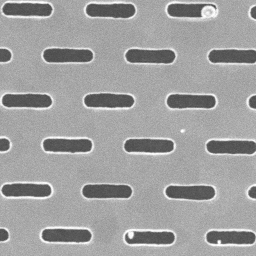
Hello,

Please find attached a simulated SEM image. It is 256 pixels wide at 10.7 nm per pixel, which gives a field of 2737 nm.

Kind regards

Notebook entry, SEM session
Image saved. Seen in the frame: a regular array of holes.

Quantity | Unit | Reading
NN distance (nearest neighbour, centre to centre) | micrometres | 0.643